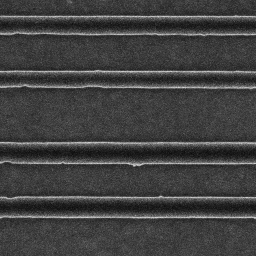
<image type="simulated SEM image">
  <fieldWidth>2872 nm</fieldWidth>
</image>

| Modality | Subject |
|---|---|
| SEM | one or a few lines or trenches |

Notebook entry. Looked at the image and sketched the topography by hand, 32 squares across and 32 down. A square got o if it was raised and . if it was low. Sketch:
................................
................................
oooooooooooooooooooooooooooooooo
oooooooooooooooooooooooooooooooo
................................
................................
................................
................................
................................
oooooooooooooooooooooooooooooooo
oooooooooooooooooooooooooooooooo
................................
................................
................................
................................
................................
................................
................................
oooooooooooooooooooooooooooooooo
oooooooooooooooooooooooooooooooo
................oo..............
................................
................................
................................
................................
oooooooooooooooooooooooooooooooo
oooooooooooooooooooooooooooooooo
................................
................................
................................
................................
................................